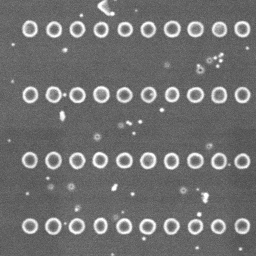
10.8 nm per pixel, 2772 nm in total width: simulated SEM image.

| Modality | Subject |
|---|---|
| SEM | a regular array of raised bodies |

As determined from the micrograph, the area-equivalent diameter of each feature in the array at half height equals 158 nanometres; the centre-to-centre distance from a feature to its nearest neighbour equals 252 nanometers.